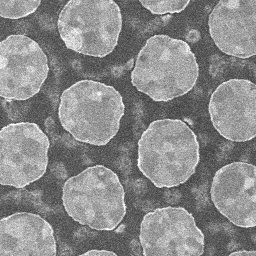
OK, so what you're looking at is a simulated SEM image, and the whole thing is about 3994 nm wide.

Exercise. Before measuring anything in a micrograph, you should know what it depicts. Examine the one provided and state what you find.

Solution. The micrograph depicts raised bodies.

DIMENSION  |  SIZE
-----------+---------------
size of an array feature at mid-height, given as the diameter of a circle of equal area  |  1000 nm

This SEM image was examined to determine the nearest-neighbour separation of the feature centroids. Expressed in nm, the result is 1320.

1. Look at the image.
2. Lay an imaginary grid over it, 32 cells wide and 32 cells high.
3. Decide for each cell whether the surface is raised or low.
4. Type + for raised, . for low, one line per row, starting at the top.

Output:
+++++...++++++....+++++....+++++
++++....+++++++....+++....++++++
........+++++++...........++++++
.........++++++...........++++++
.++.......+++++....++...+.++++++
+++++.....+++++...+++++....+++++
+++++.....++++....++++++....++++
++++++...........+++++++........
++++++...........++++++++.......
++++++..........+++++++++.......
+++++....++++....+++++++....++++
+++++...+++++++...+++++....+++++
........+++++++....++.....++++++
.......++++++++...........++++++
.......++++++++...........++++++
..++....+++++++....++++....+++++
+++++....++++++...++++++...+++++
++++++....++++...++++++++....++.
++++++...........++++++++.......
++++++...........++++++++.......
++++++...........++++++++....++.
++++++....++++....++++++...+++++
++++.....++++++....++++....+++++
........+++++++...........++++++
........+++++++...........++++++
........++++++++...........+++++
........++++++++...++++.....++++
++++++...++++++...++++++.....+++
++++++......++....+++++++.......
+++++++...........+++++++.......
+++++++...........+++++++.......
+++++++....+++....+++++++.....++